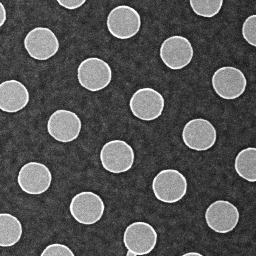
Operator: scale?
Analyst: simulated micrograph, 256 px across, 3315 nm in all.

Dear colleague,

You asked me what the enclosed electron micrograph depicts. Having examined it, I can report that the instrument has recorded a regular array of raised bodies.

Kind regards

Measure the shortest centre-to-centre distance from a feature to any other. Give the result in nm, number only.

775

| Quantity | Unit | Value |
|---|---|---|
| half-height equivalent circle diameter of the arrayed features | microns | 0.416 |